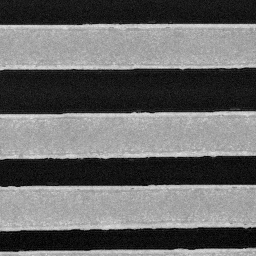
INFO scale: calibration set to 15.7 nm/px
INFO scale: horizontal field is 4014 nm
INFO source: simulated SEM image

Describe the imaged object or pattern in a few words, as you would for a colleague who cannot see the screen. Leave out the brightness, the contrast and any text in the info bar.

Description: lines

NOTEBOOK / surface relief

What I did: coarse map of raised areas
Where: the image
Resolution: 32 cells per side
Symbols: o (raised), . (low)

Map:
................................
................................
................................
oooooooooooooooooooooooooooooooo
oooooooooooooooooooooooooooooooo
oooooooooooooooooooooooooooooooo
oooooooooooooooooooooooooooooooo
oooooooooooooooooooooooooooooooo
oooooooooo.oo.ooo...............
................................
................................
................................
................................
................................
oooooooooooooooooooooooooooooooo
oooooooooooooooooooooooooooooooo
oooooooooooooooooooooooooooooooo
oooooooooooooooooooooooooooooooo
oooooooooooooooooooooooooooooooo
oooooooooooooooooooooooo........
................................
................................
................................
oooooooooooooooooooooooooooooooo
oooooooooooooooooooooooooooooooo
oooooooooooooooooooooooooooooooo
oooooooooooooooooooooooooooooooo
oooooooooooooooooooooooooooooooo
oooooooooooooo..................
................................
................................
....oooooooooooooooooooooooooooo